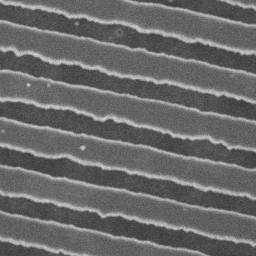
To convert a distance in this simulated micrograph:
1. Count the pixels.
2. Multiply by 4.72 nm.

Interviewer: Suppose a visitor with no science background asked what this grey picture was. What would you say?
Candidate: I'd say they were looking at lines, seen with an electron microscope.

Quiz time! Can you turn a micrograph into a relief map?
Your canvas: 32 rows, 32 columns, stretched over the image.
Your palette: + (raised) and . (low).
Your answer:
.++++++++++++++++++..........+++
......++++++++++++++++++........
...........++++++++++++++++++...
++++.............+++++++++++++++
+++++++++............+++++++++++
++++++++++++++............++++++
..+++++++++++++++++...........++
.....+++++++++++++++++++........
...........+++++++++++++++++....
++++...........+++++++++++++++++
+++++++++............+++++++++++
++++++++++++++............++++++
++++++++++++++++++++..........++
.......+++++++++++++++++........
...........++++++++++++++++++...
+++.............++++++++++++++++
+++++++++...........++++++++++++
++++++++++++++............++++++
.++++++++++++++++++..........+++
.....++++++++++++++++++.........
..........+++++++++++++++++++...
+++++...........++++++++++++++++
+++++++++............+++++++++++
++++++++++++++...........+++++++
.++++++++++++++++++............+
.......++++++++++++++++.........
+...........+++++++++++++++++...
+++++............+++++++++++++++
++++++++++...........+++++++++++
++++++++++++++............++++++
..++++++++++++++++++...........+
......+++++++++++++++++++.......